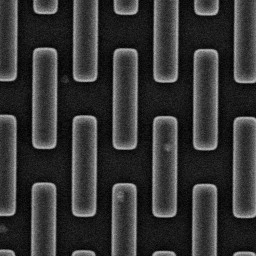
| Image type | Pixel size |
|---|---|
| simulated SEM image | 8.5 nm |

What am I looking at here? groups of lines, slits or small figures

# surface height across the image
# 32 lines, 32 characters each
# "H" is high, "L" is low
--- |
HHLLHHHLLHHHLLHHHLLHHHLLHHHLLHHH
HHLLLHHLLHHHLLLHHLLHHHLLLHHLLHHH
HHLLLLLLLHHHLLLLLLLHHHLLLLLLLHHH
HHLLLLLLLHHHLLLLLLLHHHLLLLLLLHHH
HHLLLLLLLHHHLLLLLLLHHHLLLLLLLHHH
HHLLLLLLLHHHLLLLLLLHHHLLLLLLLHHH
HHLLHHHLLHHHLLLHHLLHHHLLLHHLLHHH
HHLLHHHLLHHHLLHHHLLHHHLLHHHLLHHH
HHLLHHHLLHHHLLHHHLLHHHLLHHHLLHHH
HHLLHHHLLHHHLLHHHLLHHHLLHHHLLHHH
LLLLHHHLLLLLLLHHHLLLLLLLHHHLLLLL
LLLLHHHLLLLLLLHHHLLLLLLLHHHLLLLL
LLLLHHHLLLLLLLHHHLLLLLLLHHHLLLLL
LLLLHHHLLLLLLLHHHLLLLLLLHHHLLLLL
HLLLHHHLLLLLLLHHHLLLLLLLHHHLLLLL
HHLLHHHLLHHHLLHHHLLHHHLLHHHLLHHH
HHLLHHHLLHHHLLHHHLLHHHLLHHHLLHHH
HHLLHHHLLHHHLLHHHLLHHHLLHHHLLHHH
HHLLLLLLLHHHLLLHLLLHHHLLLHHLLHHH
HHLLLLLLLHHHLLLLLLLHHHLLLLLLLHHH
HHLLLLLLLHHHLLLLLLLHHHLLLLLLLHHH
HHLLLLLLLHHHLLLLLLLHHHLLLLLLLHHH
HHLLLLLLLHHHLLLLLLLHHHLLLLLLLHHH
HHLLHHHLLHHHLLHHHLLHHHLLHHHLLHHH
HHLLHHHLLHHHLLHHHLLHHHLLHHHLLHHH
HHLLHHHLLHHHLLHHHLLHHHLLHHHLLHHH
HHLLHHHLLHHHLLHHHLLHHHLLHHHLLHHH
LLLLHHHLLLLLLLHHHLLLLLLLHHHLLLLL
LLLLHHHLLLLLLLHHHLLLLLLLHHHLLLLL
LLLLHHHLLLLLLLHHHLLLLLLLHHHLLLLL
LLLLHHHLLLLLLLHHHLLLLLLLHHHLLLLL
HLLLHHHLLLHLLLHHHLLLHLLLHHHLLLLL